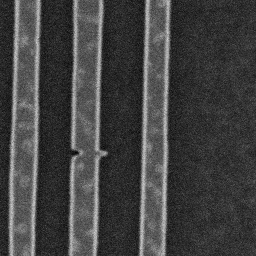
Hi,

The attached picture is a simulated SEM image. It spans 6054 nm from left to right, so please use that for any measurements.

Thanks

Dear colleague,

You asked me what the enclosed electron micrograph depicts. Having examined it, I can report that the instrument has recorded one or a few lines or trenches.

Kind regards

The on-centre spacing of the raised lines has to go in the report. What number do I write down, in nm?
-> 1540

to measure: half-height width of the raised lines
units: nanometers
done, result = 532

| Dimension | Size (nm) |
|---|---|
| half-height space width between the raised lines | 978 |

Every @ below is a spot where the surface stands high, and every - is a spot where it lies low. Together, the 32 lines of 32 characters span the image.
--@@@-----@@@------@@-----------
--@@@-----@@@------@@-----------
--@@@----@@@@-----@@@-----------
--@@@----@@@------@@@-----------
--@@@-----@@------@@@-----------
--@@@-----@@------@@@-----------
--@@@----@@@------@@@-----------
--@@@----@@@------@@@-----------
--@@@----@@@------@@@-----------
--@@@----@@@------@@@-----------
--@@-----@@@------@@@-----------
--@@@----@@@------@@@-----------
--@@@----@@@------@@@-----------
--@@@----@@@------@@@-----------
--@@-----@@@------@@@-----------
--@@-----@@@------@@@-----------
--@@-----@@@------@@@-----------
--@@-----@@@------@@@-----------
--@@-----@@@------@@@-----------
--@@------@@@-----@@@-----------
--@@-----@@@------@@@-----------
--@@-----@@@------@@@-----------
-@@@-----@@@------@@@-----------
-@@@-----@@@------@@------------
--@@-----@@@------@@------------
--@@-----@@@------@@------------
-@@@-----@@@------@@@-----------
-@@@-----@@@------@@@-----------
-@@@-----@@@------@@------------
-@@@-----@@@------@@------------
-@@@-----@@@------@@------------
-@@@-----@@@------@@------------